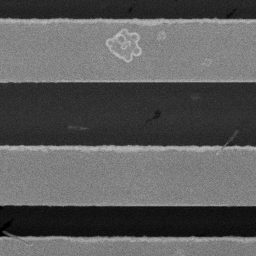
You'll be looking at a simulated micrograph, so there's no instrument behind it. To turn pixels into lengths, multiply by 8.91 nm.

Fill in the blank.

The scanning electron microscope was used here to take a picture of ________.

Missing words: lines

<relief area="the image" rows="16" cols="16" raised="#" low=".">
................
################
################
################
################
................
................
................
................
################
################
################
################
................
................
################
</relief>